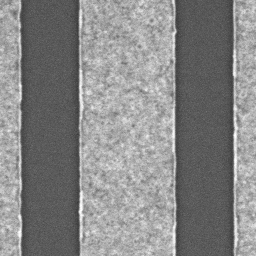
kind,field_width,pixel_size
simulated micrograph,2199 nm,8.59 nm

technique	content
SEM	one or a few lines or trenches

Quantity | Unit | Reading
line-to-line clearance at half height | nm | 513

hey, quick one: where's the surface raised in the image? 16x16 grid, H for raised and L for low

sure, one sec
HLLLLHHHHHHLLLLH
HLLLLHHHHHHLLLLH
HLLLLHHHHHHLLLLH
HLLLLHHHHHHLLLLH
HLLLLHHHHHHLLLLH
HLLLLHHHHHHLLLLH
HLLLLHHHHHHLLLLH
HLLLLHHHHHHLLLLH
HLLLLHHHHHHLLLLH
HLLLLHHHHHHLLLLH
HLLLLHHHHHHLLLLH
HLLLLHHHHHHLLLLH
HLLLLHHHHHHLLLLH
HLLLLHHHHHHLLLLH
HLLLLHHHHHHLLLLH
HLLLLHHHHHHLLLLH